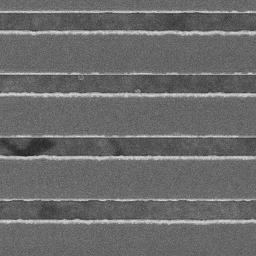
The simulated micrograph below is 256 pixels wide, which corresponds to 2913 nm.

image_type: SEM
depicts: lines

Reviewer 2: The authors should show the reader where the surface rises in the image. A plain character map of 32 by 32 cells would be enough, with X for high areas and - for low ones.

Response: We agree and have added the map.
XXXXXXXXXXXXXXXXXXXXXXXXXXXXXXXX
XXXXXXXXXXXXXXXXXXXXXXXXXXXXXXXX
--------------------------------
--------------------------------
XXXXXXXXXXXXXXXXXXXXXXXXXXXXXXXX
XXXXXXXXXXXXXXXXXXXXXXXXXXXXXXXX
XXXXXXXXXXXXXXXXXXXXXXXXXXXXXXXX
XXXXXXXXXXXXXXXXXXXXXXXXXXXXXXXX
XXXXXXXXXXXXXXXXXXXXXXXXXXXXXXXX
--------------------------------
--------------------------------
--------------------------------
XXXXXXXXXXXXXXXXXXXXXXXXXXXXXXXX
XXXXXXXXXXXXXXXXXXXXXXXXXXXXXXXX
XXXXXXXXXXXXXXXXXXXXXXXXXXXXXXXX
XXXXXXXXXXXXXXXXXXXXXXXXXXXXXXXX
XXXXXXXXXXXXXXXXXXXXXXXXXXXXXXXX
--------------------------------
--------------------------------
-----X--------------------------
XXXXXXXXXXXXXXXXXXXXXXXXXXXXXXXX
XXXXXXXXXXXXXXXXXXXXXXXXXXXXXXXX
XXXXXXXXXXXXXXXXXXXXXXXXXXXXXXXX
XXXXXXXXXXXXXXXXXXXXXXXXXXXXXXXX
XXXXXXXXXXXXXXXXXXXXXXXXXXXXXXXX
--------------------------------
--------------------------------
--------------------------------
XXXXXXXXXXXXXXXXXXXXXXXXXXXXXXXX
XXXXXXXXXXXXXXXXXXXXXXXXXXXXXXXX
XXXXXXXXXXXXXXXXXXXXXXXXXXXXXXXX
XXXXXXXXXXXXXXXXXXXXXXXXXXXXXXXX